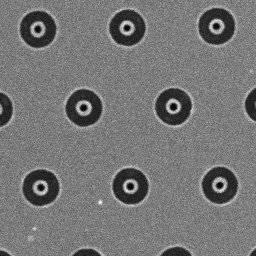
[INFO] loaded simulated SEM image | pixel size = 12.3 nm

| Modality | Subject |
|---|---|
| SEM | a regular array of ring-shaped grooves with a dot in the middle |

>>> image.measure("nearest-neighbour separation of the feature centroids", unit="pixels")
89.5